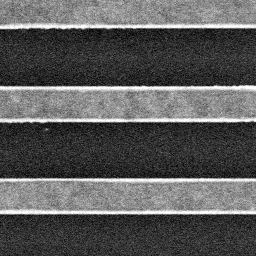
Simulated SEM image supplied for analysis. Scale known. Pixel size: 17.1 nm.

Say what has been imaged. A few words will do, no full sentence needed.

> lines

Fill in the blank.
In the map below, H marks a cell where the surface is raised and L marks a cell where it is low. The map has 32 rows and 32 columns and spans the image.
HHHHHHHHHHHHHHHHHHHHHHHHHHHHHHHH
HHHHHHHHHHHHHHHHHHHHHHHHHHHHHHHH
HHHHHHHHHHHHHHHHHHHHHHHHHHHHHHHH
LLLLLLLLLLLLLLLLLLLLLLLLLLLLLLLL
LLLLLLLLLLLLLLLLLLLLLLLLLLLLLLLL
LLLLLLLLLLLLLLLLLLLLLLLLLLLLLLLL
LLLLLLLLLLLLLLLLLLLLLLLLLLLLLLLL
LLLLLLLLLLLLLLLLLLLLLLLLLLLLLLLL
LLLLLLLLLLLLLLLLLLLLLLLLLLLLLLLL
LLLLLLLLLLLLLLLLLLLLLLLLLLLLLLLL
LLLLLLLLLLLLLLLLLLLLLLLLLLLLLLLL
HHHHHHHHHHHHHHHHHHHHHHHHHHHHHHHH
HHHHHHHHHHHHHHHHHHHHHHHHHHHHHHHH
HHHHHHHHHHHHHHHHHHHHHHHHHHHHHHHH
HHHHHHHHHHHHHHHHHHHHHHHHHHHHHHHH
LLLLLLLLLLLLLLLLLLLLLLLLLLLLLLLL
LLLLLLLLLLLLLLLLLLLLLLLLLLLLLLLL
LLLLLLLLLLLLLLLLLLLLLLLLLLLLLLLL
LLLLLLLLLLLLLLLLLLLLLLLLLLLLLLLL
LLLLLLLLLLLLLLLLLLLLLLLLLLLLLLLL
LLLLLLLLLLLLLLLLLLLLLLLLLLLLLLLL
LLLLLLLLLLLLLLLLLLLLLLLLLLLLLLLL
HHHHHHHHHHHHHHHHHHHHHHHHHHHHHHHH
HHHHHHHHHHHHHHHHHHHHHHHHHHHHHHHH
HHHHHHHHHHHHHHHHHHHHHHHHHHHHHHHH
HHHHHHHHHHHHHHHHHHHHHHHHHHHHHHHH
HHHHHHHHHHHHHHHHHHHHHHHHHHHHHHHH
LLLLLLLLLLLLLLLLLLLLLLLLLLLLLLLL
LLLLLLLLLLLLLLLLLLLLLLLLLLLLLLLL
LLLLLLLLLLLLLLLLLLLLLLLLLLLLLLLL
LLLLLLLLLLLLLLLLLLLLLLLLLLLLLLLL
LLLLLLLLLLLLLLLLLLLLLLLLLLLLLLLL